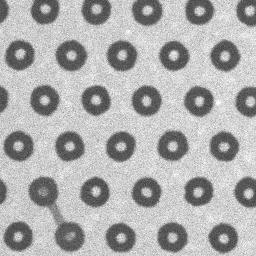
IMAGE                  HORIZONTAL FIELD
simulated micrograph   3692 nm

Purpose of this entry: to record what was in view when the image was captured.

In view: a regular array of ring-shaped grooves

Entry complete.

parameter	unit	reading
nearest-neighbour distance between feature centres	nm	737